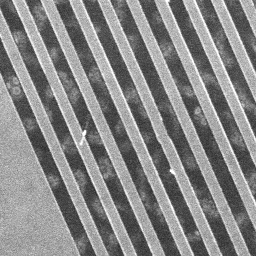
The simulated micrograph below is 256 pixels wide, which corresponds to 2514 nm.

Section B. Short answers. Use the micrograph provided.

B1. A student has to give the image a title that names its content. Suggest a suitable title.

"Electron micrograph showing parallel lines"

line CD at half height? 0.104 microns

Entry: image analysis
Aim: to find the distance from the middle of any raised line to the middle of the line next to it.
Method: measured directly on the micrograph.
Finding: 255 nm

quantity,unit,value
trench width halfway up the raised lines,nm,151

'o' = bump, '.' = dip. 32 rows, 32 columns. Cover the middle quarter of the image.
..oo.....oo.....ooo....ooo....oo
..ooo....ooo....ooo....ooo....oo
..ooo.....oo.....oo.....ooo....o
...ooo....ooo....ooo....ooo....o
...ooo....ooo....ooo.....oo.....
....ooo....ooo....ooo....ooo....
....ooo....ooo....ooo....ooo....
.....oo.....ooo....ooo....ooo...
o....ooo....ooo....ooo....ooo...
o.....oo.....oo.....ooo....ooo..
oo....ooo....ooo....ooo....ooo..
oo....ooo....ooo.....oo.....oo..
ooo....ooo....ooo....ooo....ooo.
ooo....ooo....ooo....ooo.....oo.
.oo.....ooo....ooo....ooo....ooo
.ooo....ooo....ooo....ooo....ooo
..oo.....oo.....oo.....oo.....oo
..ooo....ooo....ooo....ooo....oo
..ooo....ooo.....oo....ooo.....o
...ooo....ooo....ooo....ooo....o
...ooo....ooo....ooo.....oo.....
....ooo....ooo....ooo....ooo....
....ooo....ooo....ooo....ooo....
.....oo.....oo.....ooo....ooo...
o....ooo....ooo....ooo....ooo...
o....ooo.....oo.....oo.....ooo..
oo....ooo....ooo....ooo....ooo..
oo....ooo....ooo.....oo....ooo..
ooo....ooo....ooo....ooo....ooo.
ooo....ooo....ooo....ooo....ooo.
.oo.....oo.....ooo....ooo....ooo
.ooo....ooo....ooo....ooo....ooo